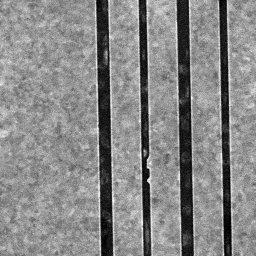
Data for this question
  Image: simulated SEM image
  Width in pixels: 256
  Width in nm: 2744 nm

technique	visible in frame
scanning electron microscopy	parallel lines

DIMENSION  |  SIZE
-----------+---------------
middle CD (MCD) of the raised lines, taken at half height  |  320 nanometers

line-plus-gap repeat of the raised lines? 431 nm